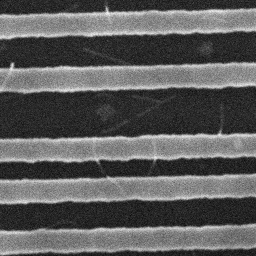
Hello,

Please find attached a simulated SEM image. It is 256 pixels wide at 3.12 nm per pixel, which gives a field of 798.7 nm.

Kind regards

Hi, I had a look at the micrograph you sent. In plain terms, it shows lines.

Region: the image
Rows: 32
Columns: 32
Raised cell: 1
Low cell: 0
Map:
00000000000000000000000000000000
00000000000001011111111111111111
11111111111111111111111111111111
11111111111111111111111111111111
11111111001100000000000000000000
00000000000000000000000000000000
00000000000000000000000000000000
00000000000000000000000000000000
01000001111111111111111111111111
11111111111111111111111111111111
11111111111111111111111111111111
00110000000000000000000000000000
00000000000000000000000000000000
00000000000000000000000000000000
00000000000000000000000000000000
00000000000000000000000000000000
00000000000000000000000000000000
11111111111111111111111111111111
11111111111111111111111111111111
11111111111111111111111111111111
00000000000000000000000000000000
00000000000000000000000000000000
00010001111111111111111111111111
11111111111111111111111111111111
11111111111111111111111111111111
00000000000000000000000000000000
00000000000000000000000000000000
00000000000000000000000000000000
00000000000000010111111111111111
11111111111111111111111111111111
11111111111111111111111111111111
11111111111001000000000000000000